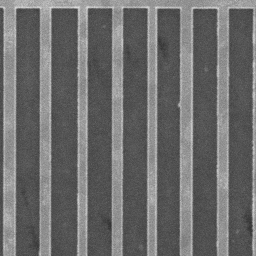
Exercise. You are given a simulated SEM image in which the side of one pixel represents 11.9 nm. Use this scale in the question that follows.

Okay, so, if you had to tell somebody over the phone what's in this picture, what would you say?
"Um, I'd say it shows parallel lines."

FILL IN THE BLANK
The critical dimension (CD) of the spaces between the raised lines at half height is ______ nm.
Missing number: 312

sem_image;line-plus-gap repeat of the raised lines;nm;425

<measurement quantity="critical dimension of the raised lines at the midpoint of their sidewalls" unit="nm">115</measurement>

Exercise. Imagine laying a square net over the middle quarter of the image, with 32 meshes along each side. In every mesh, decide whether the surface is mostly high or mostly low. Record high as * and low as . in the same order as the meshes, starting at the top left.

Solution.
....**......**.......**......***
....**......**.......**......***
....**......**.......**......***
....**......**.......**......***
....**......**.......**......***
....**......**.......**......***
....**......**.......**......***
....**......**.......**......***
....**......**.......**......***
....**......**.......**......***
....**......**.......**......***
....**......**.......**......***
....**......***......**......***
....**......***......**......***
....**......***......**......***
....**......***......**......***
....**......***......**......***
....**......**.......**......***
....**......**.......**......***
....**......**.......**......***
....**......**.......**......***
....**......**.......**......***
....**......**.......**......***
....**......**.......**......***
....**......***......**......***
....**......***......**......***
....**......**.......**......***
....**......**.......**......***
....**......**.......**......***
....**......**.......**......***
....**......**.......**......***
....**......**.......**......***